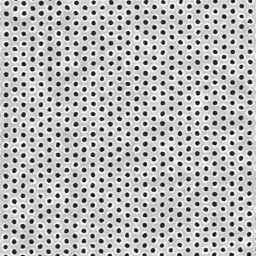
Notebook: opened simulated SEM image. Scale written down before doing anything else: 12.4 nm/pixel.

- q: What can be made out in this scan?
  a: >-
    a regular array of holes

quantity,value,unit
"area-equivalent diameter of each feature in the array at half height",62.8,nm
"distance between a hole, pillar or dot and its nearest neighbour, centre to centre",122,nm